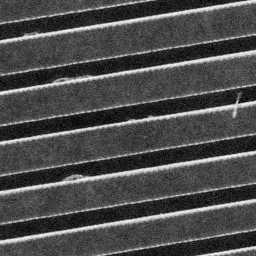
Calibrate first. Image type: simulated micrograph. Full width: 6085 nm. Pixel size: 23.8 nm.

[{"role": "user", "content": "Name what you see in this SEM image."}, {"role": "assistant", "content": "lines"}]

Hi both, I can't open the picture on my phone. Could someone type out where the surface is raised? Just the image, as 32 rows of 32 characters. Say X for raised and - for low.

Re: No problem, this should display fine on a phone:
XXXXXXXXXXXXXXXX-------------XXX
XXXXXXXXXX-------------XXXXXXXXX
XXX-------------XXXXXXXXXXXXXXXX
----------XXXXXXXXXXXXXXXXXXXXXX
----XXXXXXXXXXXXXXXXXXXXXXXXXXX-
XXXXXXXXXXXXXXXXXXXXXXXXX-------
XXXXXXXXXXXXXXXXXX-------------X
XXXXXXXXXXXX-------------XXXXXXX
XXXXXX------------XXXXXXXXXXXXXX
-------------XXXXXXXXXXXXXXXXXXX
------XXXXXXXXXXXXXXXXXXXXXXXXXX
-XXXXXXXXXXXXXXXXXXXXXXXXXX-----
XXXXXXXXXXXXXXXXXXXX------------
XXXXXXXXXXXXXX-------------XXXXX
XXXXXXXX-------------XXXXXXXXXXX
XX------------XXXXXXXXXXXXXXXXXX
--------XXXXXXXXXXXXXXXXXXXXXXXX
--XXXXXXXXXXXXXXXXXXXXXXXXXX----
XXXXXXXXXXXXXXXXXXXXX-----------
XXXXXXXXXXXXXXX-------------XXXX
XXXXXXXXX-------------XXXXXXXXXX
XXX-------------XXXXXXXXXXXXXXXX
---------XXXXXXXXXXXXXXXXXXXXXXX
---XXXXXXXXXXXXXXXXXXXXXXXXX----
XXXXXXXXXXXXXXXXXXXXXX----------
XXXXXXXXXXXXXXXX-------------XXX
XXXXXXXXX--------------XXXXXXXXX
XXXX-------------XXXXXXXXXXXXXXX
----------XXXXXXXXXXXXXXXXXXXXXX
----XXXXXXXXXXXXXXXXXXXXXXXX----
XXXXXXXXXXXXXXXXXXXXXX----------
XXXXXXXXXXXXXXXX------------XXXX